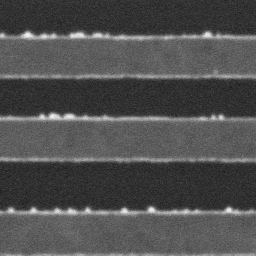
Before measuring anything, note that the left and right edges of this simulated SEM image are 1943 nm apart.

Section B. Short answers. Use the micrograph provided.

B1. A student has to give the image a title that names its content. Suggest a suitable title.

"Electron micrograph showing lines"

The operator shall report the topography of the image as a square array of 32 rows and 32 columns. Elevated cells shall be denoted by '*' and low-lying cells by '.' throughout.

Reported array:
................................
................................
................................
................................
................................
********************************
********************************
********************************
********************************
********************************
................................
................................
................................
................................
................................
********************************
********************************
********************************
********************************
********************************
................................
................................
................................
................................
................................
................................
................................
********************************
********************************
********************************
********************************
********************************